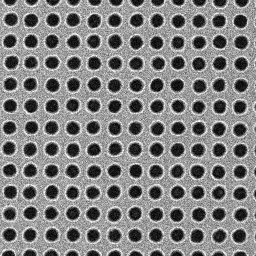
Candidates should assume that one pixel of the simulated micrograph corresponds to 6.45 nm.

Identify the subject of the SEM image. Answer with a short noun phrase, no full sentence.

a regular array of holes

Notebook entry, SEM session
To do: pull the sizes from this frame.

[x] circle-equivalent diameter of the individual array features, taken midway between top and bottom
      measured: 88.2 nanometers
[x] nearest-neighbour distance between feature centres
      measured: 132 nanometres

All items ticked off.